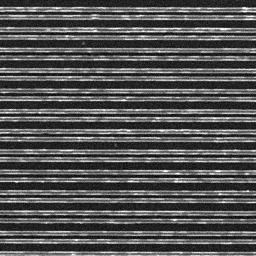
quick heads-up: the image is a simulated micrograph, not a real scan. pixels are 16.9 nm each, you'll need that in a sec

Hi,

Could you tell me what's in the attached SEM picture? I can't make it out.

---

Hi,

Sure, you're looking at parallel lines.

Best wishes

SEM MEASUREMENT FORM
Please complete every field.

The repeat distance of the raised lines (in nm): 170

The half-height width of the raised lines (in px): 4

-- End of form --